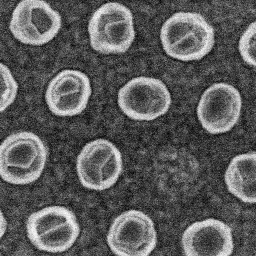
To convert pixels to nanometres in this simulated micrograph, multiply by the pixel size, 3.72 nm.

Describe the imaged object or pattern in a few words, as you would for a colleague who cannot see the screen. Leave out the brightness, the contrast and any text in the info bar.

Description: raised bodies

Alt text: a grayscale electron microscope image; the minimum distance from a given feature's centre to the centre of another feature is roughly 281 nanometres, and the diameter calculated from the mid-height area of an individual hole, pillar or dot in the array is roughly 163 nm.